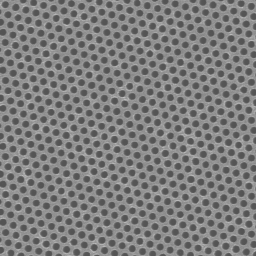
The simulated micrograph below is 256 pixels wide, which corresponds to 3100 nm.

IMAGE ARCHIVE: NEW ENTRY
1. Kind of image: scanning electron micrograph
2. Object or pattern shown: a regular array of holes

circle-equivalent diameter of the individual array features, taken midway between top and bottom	83.1	nm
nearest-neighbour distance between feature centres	0.124	micrometres